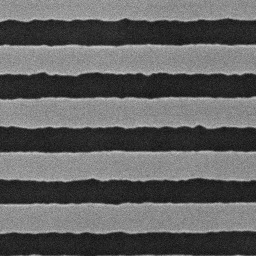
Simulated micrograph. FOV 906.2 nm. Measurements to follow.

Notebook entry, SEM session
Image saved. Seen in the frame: lines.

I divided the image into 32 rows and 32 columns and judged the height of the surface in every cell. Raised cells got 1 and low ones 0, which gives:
11111111111111111111111111111111
11111111111111111111111111111111
10110000100001100011011110000000
00000000000000000000000000000000
00000000000000000000000000000000
00000000000000000000000000000000
11111111111111111111111111111111
11111111111111111111111111111111
11111111111111111111111111111111
00000000000000000000000000000000
00000000000000000000000000000000
00000000000000000000000000000000
11111111111111111111111111111111
11111111111111111111111111111111
11111111111111111111111111111111
11111111111111111111111111111111
00000000000000000000000000000000
00000000000000000000000000000000
00000000000000000000000000000000
11111111111111111111111111111111
11111111111111111111111111111111
11111111111111111111111111111111
00001111100011001110001000001111
00000000000000000000000000000000
00000000000000000000000000000000
00001011111110011111111111111111
11111111111111111111111111111111
11111111111111111111111111111111
11111111111111111111111111111111
00000000000000000000000000000000
00000000000000000000000000000000
00000000000000000000000000000000